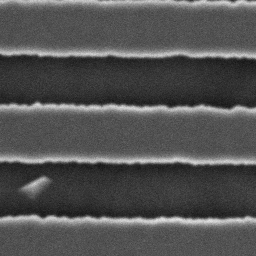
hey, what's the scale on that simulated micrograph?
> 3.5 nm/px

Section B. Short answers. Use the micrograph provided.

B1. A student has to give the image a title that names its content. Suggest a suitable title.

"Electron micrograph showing lines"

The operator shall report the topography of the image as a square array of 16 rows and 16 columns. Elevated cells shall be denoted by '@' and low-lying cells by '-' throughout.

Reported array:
@@@@@@@@@@@@@@@@
@@@@@@@@@@@@@@@@
@@@@@@@@@@@@@@@@
--------@@--@@@@
----------------
----------------
----------------
@@@@@@@@@@@@@@@@
@@@@@@@@@@@@@@@@
@@@@@@@@@@@@@@@@
----------------
----------------
----------------
----------------
@@@@@@@@@@@@@@@@
@@@@@@@@@@@@@@@@